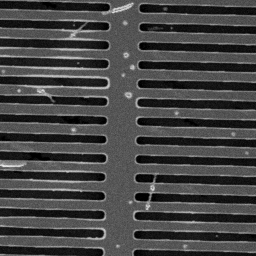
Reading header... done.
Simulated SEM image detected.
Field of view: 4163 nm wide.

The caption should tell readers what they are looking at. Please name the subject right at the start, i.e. groups of lines, slits or small figures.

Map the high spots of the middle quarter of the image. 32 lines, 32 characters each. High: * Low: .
...........********.............
********************............
********************************
..........**********************
...........********.............
...........********.............
*****************************...
********************************
...........********...**********
...........*******..............
*******...*********.............
********************************
********************************
...........********.............
...........*******..............
*********************...........
********************************
********************************
...........*******..............
...........*******..............
*************************.......
********************************
..........**********************
...........*******..............
..........********..............
********************************
********************************
..........*********.....********
..........********..............
******************....*.........
********************************
....****************************